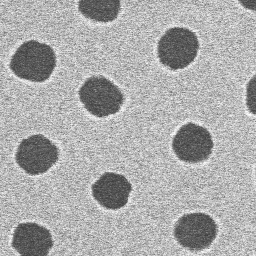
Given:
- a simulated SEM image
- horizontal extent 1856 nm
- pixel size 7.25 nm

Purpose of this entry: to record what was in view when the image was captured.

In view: holes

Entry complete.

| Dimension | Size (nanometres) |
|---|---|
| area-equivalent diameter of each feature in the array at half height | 303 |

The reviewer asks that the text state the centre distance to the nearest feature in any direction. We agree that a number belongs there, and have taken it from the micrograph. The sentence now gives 608 nm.